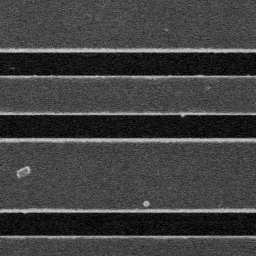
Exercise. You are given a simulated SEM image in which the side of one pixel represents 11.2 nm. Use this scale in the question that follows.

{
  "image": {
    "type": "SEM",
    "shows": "lines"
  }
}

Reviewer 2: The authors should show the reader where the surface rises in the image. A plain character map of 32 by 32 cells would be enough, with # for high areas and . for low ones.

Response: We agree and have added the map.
################################
################################
################################
################################
################################
################################
................................
................................
................................
................................
################################
################################
################################
################################
................................
................................
................................
################################
################################
################################
################################
################################
################################
################################
################################
################################
...#.....#......#...............
................................
................................
................................
################################
################################